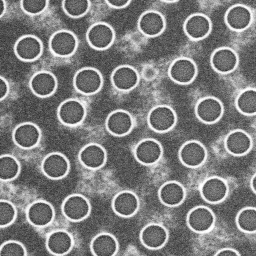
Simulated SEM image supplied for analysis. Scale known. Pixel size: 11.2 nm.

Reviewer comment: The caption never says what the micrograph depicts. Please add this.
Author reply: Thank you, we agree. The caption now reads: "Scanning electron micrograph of a regular array of holes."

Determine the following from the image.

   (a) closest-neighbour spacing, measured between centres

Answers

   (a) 38.6 pixels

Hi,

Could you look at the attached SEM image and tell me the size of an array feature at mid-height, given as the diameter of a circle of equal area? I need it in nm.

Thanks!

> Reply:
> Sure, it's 274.